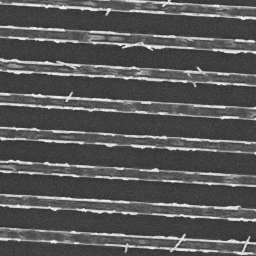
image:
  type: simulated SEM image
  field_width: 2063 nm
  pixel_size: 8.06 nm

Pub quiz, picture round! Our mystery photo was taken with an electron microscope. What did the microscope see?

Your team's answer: parallel lines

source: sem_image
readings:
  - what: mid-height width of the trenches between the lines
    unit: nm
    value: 174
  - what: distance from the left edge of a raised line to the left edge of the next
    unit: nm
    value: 270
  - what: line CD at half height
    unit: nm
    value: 94.6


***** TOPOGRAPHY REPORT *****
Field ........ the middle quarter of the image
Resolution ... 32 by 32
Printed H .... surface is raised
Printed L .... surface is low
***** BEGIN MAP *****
HHHHHHHHHHLLLLLLLLLLLLLLLLLLLLLL
HHHHHHHHHHHHHHHHHHHHHHHHHHHLLLLL
HHHHHHHHHHHHHHHHHHHHHHHHHHHHHHHH
LLLLLLLLLLLLLLLHHHHHHHHHHHHHHHHH
LLLLLLLLLLLLLLLLLLLLLLLLLLLLLHHL
LLLLLLLLLLLLLLLLLLLLLLLLLLLLLLLL
LLLLLLLLLLLLLLLLLLLLLLLLLLLLLLLL
LLLLLLLLLLLLLLLLLLLLLLLLLLLLLLLL
HHHHLLLLLLLLLLLLLLLLLLLLLLLLLLLL
HHHHHHHHHHHHHHHHHHLHHLLLLLLLLLLL
HHHHHHHHHHHHHHHHHHHHHHHHHHHHHHHH
LLLLLLHHLHHHHHHHHHHHHHHHHHHHHHHH
LLLLLLLLLLLLLLLLLLLLLLLHHLLHHHHH
LLLLLLLLLLLLLLLLLLLLLLLLLLLLLLLL
LLLLLLLLLLLLLLLLLLLLLLLLLLLLLLLL
LLLLLLLLLLLLLLLLLLLLLLLLLLLLLLLL
LLLLLLLLLLLLLLLLLLLLLLLLLLLLLLLL
HHHHHHHHHHHHLLLLLLLLLLLLLLLLLLLL
HHHHHHHHHHHHHHHHHHHHHHHHHHHHHHLL
HHHHHHHHHHHHHHHHHHHHHHHHHHHHHHHH
LLLLLLLLLLLHLLLLLHHHHHHHHHHHHHHH
LLLLLLLLLLLLLLLLLLLLLLLLLLLLLLHH
LLLLLLLLLLLLLLLLLLLLLLLLLLLLLLLL
LLLLLLLLLLLLLLLLLLLLLLLLLLLLLLLL
LLLLLLLLLLLLLLLLLLLLLLLLLLLLLLLL
HHHHLLLLLLLLLLLLLLLLLLLLLLLLLLLL
HHHHHHHHHHHHHHHHHHHHLLHHLLLLLLLL
HHHHHHHHHHHHHHHHHHHHHHHHHHHHHHHH
LLLLLLLLLLLHHHHHHHHHHHHHHHHHHHHH
LLLLLLLLLLLLLLLLLLLLLLLLLLLHLHHH
LLLLLLLLLLLLLLLLLLLLLLLLLLLLLLLL
LLLLLLLLLLLLLLLLLLLLLLLLLLLLLLLL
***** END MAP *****